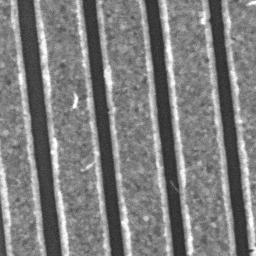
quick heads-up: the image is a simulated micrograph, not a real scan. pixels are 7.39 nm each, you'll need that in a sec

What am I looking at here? one or a few lines or trenches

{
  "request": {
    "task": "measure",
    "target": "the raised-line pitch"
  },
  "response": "0.458 µm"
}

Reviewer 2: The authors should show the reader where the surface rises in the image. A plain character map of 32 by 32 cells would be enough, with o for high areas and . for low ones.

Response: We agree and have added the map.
oo...ooooo..oooooo..oooooo..oooo
oo...ooooo..oooooo..oooooo..oooo
oo...ooooo..oooooo..oooooo..oooo
oo...ooooo...ooooo..oooooo..oooo
oo...oooooo..ooooo...ooooo..oooo
oo...oooooo..oooooo..ooooo..oooo
ooo..oooooo..oooooo..oooooo..ooo
ooo..oooooo..oooooo..oooooo..ooo
ooo..oooooo..oooooo..oooooo..ooo
ooo..oooooo..oooooo..oooooo..ooo
ooo...ooooo..oooooo..oooooo..ooo
ooo...ooooo..oooooo..oooooo..ooo
ooo...ooooo...ooooo..oooooo..ooo
ooo...oooooo..ooooo...ooooo..ooo
oooo..oooooo..ooooo...ooooo...oo
oooo..oooooo..oooooo..oooooo..oo
oooo..oooooo..oooooo..oooooo..oo
oooo..oooooo..oooooo..oooooo..oo
oooo..oooooo..oooooo..oooooo..oo
oooo...ooooo..oooooo..oooooo..oo
oooo...ooooo...ooooo..oooooo..oo
oooo...ooooo...ooooo..oooooo..oo
oooo...oooooo..ooooo...ooooo..oo
ooooo..oooooo..oooooo..ooooo...o
ooooo..oooooo..oooooo..oooooo..o
ooooo..oooooo..oooooo..oooooo..o
.oooo..oooooo..oooooo..oooooo..o
.oooo..oooooo..oooooo..oooooo..o
.oooo...ooooo..oooooo..oooooo..o
.oooo...ooooo...ooooo..oooooo..o
.oooo...ooooo...ooooo..oooooo..o
.ooooo..oooooo..ooooo..oooooo...